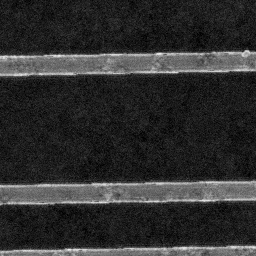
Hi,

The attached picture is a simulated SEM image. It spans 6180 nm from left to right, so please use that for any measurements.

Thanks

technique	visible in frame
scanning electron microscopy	lines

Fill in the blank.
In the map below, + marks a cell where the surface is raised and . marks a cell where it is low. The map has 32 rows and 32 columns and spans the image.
................................
................................
................................
................................
................................
................................
..............................++
++++++++++++++++++++++++++++++++
++++++++++++++++++++++++++++++++
................................
................................
................................
................................
................................
................................
................................
................................
................................
................................
................................
................................
................................
................................
++++++++++++++++++++++++++++++++
++++++++++++++++++++++++++++++++
................................
................................
................................
................................
................................
................................
++++++++++++++++++++++++++++++++